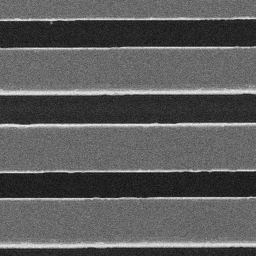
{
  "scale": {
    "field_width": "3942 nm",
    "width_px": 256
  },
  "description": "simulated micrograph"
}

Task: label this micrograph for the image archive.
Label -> lines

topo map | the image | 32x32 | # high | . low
################################
################################
##########......................
................................
................................
................................
################################
################################
################################
################################
################################
################################
................................
................................
................................
...................#..##########
################################
################################
################################
################################
################################
######..##......................
................................
................................
................................
################################
################################
################################
################################
################################
################################
................................